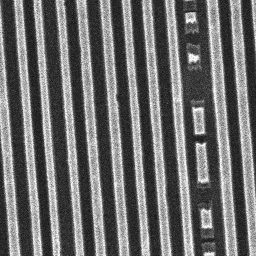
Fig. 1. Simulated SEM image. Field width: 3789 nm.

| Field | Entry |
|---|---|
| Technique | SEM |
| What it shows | parallel lines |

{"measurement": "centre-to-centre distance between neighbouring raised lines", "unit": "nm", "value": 321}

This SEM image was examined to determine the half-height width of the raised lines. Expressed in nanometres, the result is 151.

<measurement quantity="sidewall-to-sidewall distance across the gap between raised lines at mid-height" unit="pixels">11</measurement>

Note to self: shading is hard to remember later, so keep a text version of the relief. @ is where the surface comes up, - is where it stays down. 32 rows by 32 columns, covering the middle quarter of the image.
@---@@@---@@@---@@---@@----@@---
@---@@@---@@@---@@---@@----@@---
@---@@@---@@@---@@---@@----@@---
@@--@@@---@@@---@@---@@----@@---
@@---@@---@@@---@@---@@----@@---
@@---@@----@@---@@---@@@---@@---
@@---@@----@@---@@---@@@---@@---
@@---@@----@@---@@---@@@---@@---
@@---@@----@@---@@---@@@---@@---
@@---@@@---@@---@@@--@@@---@@---
@@---@@@---@@@--@@@--@@@---@@---
@@---@@@---@@@---@@--@@@---@@@--
@@---@@@---@@@---@@---@@---@@@--
@@---@@@---@@@---@@---@@---@@@--
@@@--@@@---@@@---@@---@@---@@@--
-@@--@@@---@@@---@@---@@----@@--
-@@--@@@---@@@---@@---@@----@@--
-@@---@@----@@---@@---@@----@@--
-@@---@@----@@---@@---@@@---@@--
-@@---@@----@@---@@---@@@---@@--
-@@---@@----@@---@@---@@@---@@--
-@@---@@----@@---@@---@@@---@@--
-@@---@@@---@@---@@@---@@---@@--
-@@---@@@---@@@---@@---@@---@@--
-@@---@@@---@@@---@@---@@---@@@-
-@@---@@@---@@@---@@---@@----@@-
-@@@--@@@---@@@---@@---@@----@@-
-@@@--@@@---@@@---@@---@@----@@-
--@@--@@@---@@@---@@---@@----@@-
--@@---@@---@@@---@@---@@----@@-
--@@---@@----@@---@@---@@----@@-
--@@---@@----@@---@@---@@----@@-